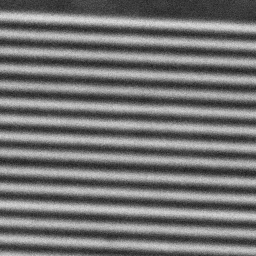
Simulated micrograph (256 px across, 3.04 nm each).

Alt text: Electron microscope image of parallel lines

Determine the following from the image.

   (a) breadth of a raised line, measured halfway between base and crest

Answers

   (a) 15.2 nanometers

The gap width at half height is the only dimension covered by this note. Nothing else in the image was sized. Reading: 38.3 nm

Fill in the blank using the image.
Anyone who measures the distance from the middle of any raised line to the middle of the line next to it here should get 51.9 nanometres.